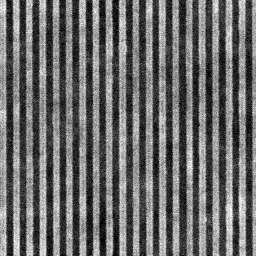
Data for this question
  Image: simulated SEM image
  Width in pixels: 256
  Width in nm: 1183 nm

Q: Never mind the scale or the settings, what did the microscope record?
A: parallel lines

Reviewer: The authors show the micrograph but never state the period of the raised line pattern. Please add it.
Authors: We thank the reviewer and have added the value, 0.0614 um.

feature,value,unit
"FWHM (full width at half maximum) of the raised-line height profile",23.1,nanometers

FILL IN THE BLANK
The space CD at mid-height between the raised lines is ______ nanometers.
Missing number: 37